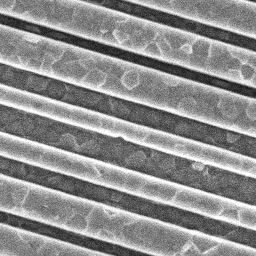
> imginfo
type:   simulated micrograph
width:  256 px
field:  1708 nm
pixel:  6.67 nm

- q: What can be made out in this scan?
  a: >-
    parallel lines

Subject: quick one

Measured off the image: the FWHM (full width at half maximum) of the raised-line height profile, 226 nm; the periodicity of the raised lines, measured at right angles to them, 317 nm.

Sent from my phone